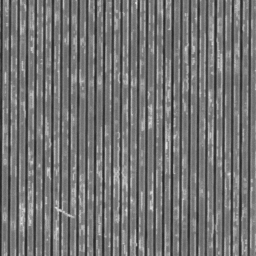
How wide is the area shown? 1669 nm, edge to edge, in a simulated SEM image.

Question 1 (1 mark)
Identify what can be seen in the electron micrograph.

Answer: parallel lines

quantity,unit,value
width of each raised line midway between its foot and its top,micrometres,0.0391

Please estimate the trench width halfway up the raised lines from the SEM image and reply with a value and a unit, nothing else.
19.6 nm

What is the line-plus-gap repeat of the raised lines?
55.8 nm